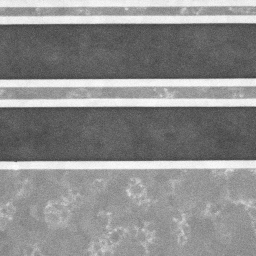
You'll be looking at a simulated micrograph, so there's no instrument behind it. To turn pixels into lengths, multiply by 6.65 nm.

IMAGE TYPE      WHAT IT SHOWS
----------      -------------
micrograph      one or a few lines or trenches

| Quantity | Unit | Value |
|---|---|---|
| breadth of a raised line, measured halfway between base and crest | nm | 120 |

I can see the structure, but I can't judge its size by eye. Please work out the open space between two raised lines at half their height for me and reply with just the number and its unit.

422 nanometers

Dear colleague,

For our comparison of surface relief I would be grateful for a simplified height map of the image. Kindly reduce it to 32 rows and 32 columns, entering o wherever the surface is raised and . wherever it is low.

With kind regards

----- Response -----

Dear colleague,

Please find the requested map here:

oooooooooooooooooooooooooooooooo
oooooooooooooooooooooooooooooooo
................................
................................
................................
................................
................................
................................
................................
................................
..............oooooooooooooooooo
oooooooooooooooooooooooooooooooo
oooooooooooooooooooooooooooooooo
................................
................................
................................
................................
................................
................................
................................
................................
oooooooooooooooooooooooooooooooo
oooooooooooooooooooooooooooooooo
oooooooooooooooooooooooooooooooo
oooooooooooooooooooooooooooooooo
oooooooooooooooooooooooooooooooo
oooooooooooooooooooooooooooooooo
oooooooooooooooooooooooooooooooo
oooooooooooooooooooooooooooooooo
oooooooooooooooooooooooooooooooo
oooooooooooooooooooooooooooooooo
oooooooooooooooooooooooooooooooo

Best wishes